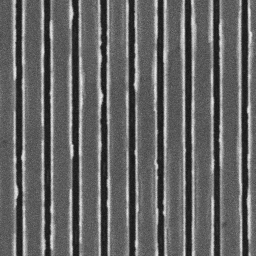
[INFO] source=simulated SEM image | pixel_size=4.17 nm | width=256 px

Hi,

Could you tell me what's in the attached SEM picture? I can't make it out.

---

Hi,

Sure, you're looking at parallel lines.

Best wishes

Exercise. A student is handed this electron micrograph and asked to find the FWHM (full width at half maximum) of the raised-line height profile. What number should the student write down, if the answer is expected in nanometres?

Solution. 90.2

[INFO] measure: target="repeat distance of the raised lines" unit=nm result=118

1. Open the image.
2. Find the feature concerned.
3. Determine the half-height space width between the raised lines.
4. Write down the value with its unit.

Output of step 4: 6.38 px